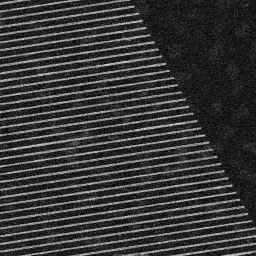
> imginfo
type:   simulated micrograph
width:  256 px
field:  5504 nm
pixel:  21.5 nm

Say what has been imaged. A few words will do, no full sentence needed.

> parallel lines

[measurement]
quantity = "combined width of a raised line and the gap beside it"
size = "0.165 micrometres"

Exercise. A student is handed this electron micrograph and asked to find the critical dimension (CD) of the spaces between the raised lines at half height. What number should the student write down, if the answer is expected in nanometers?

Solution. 136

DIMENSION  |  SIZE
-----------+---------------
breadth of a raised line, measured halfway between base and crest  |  31.9 nm